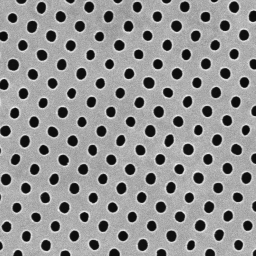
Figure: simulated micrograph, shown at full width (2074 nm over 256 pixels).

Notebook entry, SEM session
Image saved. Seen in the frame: a regular array of holes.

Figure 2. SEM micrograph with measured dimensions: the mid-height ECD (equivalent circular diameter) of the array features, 0.0848 um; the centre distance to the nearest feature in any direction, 0.17 um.